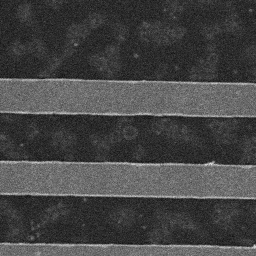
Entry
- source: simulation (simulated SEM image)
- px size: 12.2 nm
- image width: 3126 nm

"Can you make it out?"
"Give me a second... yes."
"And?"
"one or a few lines or trenches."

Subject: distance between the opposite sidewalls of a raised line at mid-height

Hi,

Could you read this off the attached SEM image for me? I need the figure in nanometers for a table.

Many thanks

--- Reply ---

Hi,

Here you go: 404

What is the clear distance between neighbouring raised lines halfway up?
601 nm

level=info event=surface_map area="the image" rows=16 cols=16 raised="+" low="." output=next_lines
................
................
................
................
................
++++++++++++++++
++++++++++++++++
................
................
................
++++++++++++++++
++++++++++++++++
................
................
................
++++++++++++++++